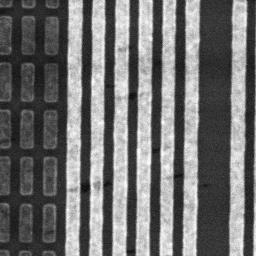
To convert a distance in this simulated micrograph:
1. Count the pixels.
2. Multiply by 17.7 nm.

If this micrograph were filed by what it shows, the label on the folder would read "wiring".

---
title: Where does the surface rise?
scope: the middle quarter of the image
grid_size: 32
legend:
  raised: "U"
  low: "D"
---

DUUUDDDUUUDDDUUUDDDUUUDDDUUUDDDU
DUUUDDDUUUDDDUUUDDDUUUDDDUUUDDDU
DUUUDDDUUUDDDUUUDDDUUUDDDUUUDDDU
DUUUDDDUUUDDDUUUDDDUUUDDDUUUDDDU
DUUUDDDUUUDDDUUUDDDUUUDDDUUDDDDU
DUUUDDDUUUDDDUUUDDDUUUDDDUUDDDDU
DUUUDDDUUUDDDUUUDDDUUUDDDUUDDDDU
DUUUDDDUUUDDDUUUDDDUUUDDDUUDDDDU
DUUUDDDUUUDDDUUUDDDUUUDDDUUDDDDU
DUUUDDDUUUDDDUUUDDDUUUDDDUUDDDDU
DUUUDDDUUUDDDUUUDDDUUUDDDUUDDDDU
DUUUDDDUUUDDDUUUDDDUUUDDDUUDDDDU
DUUUDDDUUUDDDUUUDDDUUUDDDUUDDDUU
DUUUDDDUUUDDDUUUDDDUUUDDUUUDDDUU
DUUUDDDUUUDDDUUUDDDUUUDDUUUDDDUU
DUUUDDDUUUDDDUUUDDDUUUDDUUUDDDUU
DUUUDDDUUUDDDUUUDDDUUUDDUUUDDDUU
DUUUDDDUUUDDDUUUDDDUUUDDUUUDDDUU
DUUUDDDUUUDDDUUUDDDUUUDDUUUDDDUU
DUUUDDDUUUDDDUUUDDDUUUDDUUUDDDUU
DUUUDDDUUUDDDUUUDDDUUUDDUUUDDDUU
DUUUDDDUUUDDDUUUDDDUUUDDUUUDDDUU
DUUUDDDUUUDDDUUUDDDUUUDDUUUDDDUU
DUUUDDDUUUDDDUUUDDUUUUDDUUUDDDUU
DUUUDDDUUUDDDUUUDDUUUUDDUUUDDDUU
DUUUDDDUUUDDDUUUDDUUUDDDUUUDDDUU
DUUUDDDUUDDDDUUUDDUUUDDDUUUDDDUU
DUUUDDDUUDDDDUUUDDUUUDDDUUUDDDUU
DUUUDDDUUDDDDUUUDDUUUDDDUUUDDDUU
DUUUDDDUUDDDDUUUDDUUUDDDUUUDDDUU
DUUUDDDUUDDDDUUUDDUUUDDDUUUDDDUU
DUUUDDDUUDDDDUUUDDUUUDDDUUUDDDUU